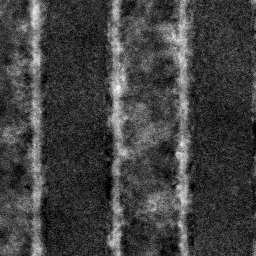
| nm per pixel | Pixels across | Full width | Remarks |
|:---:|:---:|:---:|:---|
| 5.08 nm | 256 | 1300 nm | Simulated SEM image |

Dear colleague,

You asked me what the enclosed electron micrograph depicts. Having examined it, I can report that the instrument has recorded one or a few lines or trenches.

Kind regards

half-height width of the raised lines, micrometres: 0.345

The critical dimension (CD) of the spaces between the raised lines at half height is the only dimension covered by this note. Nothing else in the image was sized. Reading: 397 nanometers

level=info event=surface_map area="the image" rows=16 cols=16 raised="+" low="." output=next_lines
++.....++++.....
++.....++++.....
++.....++++.....
++.....++++.....
++.....++++.....
++.....+++++....
++.....++++.....
++.....++++.....
++.....+++++....
++.....++++.....
++.....++++.....
++.....+++++....
++.....+++++....
++.....++++.....
++.....++++.....
++.....+++++....